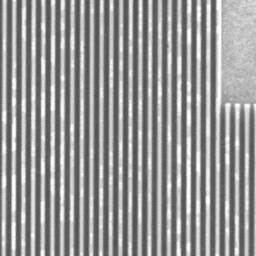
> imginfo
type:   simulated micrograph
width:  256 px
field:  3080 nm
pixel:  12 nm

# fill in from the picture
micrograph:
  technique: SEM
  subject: parallel lines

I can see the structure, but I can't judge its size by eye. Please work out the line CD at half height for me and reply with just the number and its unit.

46.6 nm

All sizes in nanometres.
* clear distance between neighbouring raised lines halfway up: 69.2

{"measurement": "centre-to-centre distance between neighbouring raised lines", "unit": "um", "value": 0.117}